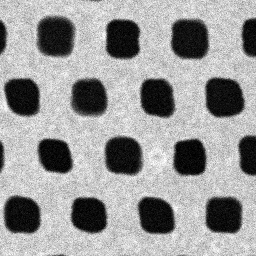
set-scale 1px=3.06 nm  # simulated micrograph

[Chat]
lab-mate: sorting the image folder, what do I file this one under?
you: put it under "a regular array of holes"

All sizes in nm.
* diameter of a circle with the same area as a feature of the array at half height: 117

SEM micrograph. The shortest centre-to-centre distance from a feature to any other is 0.204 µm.